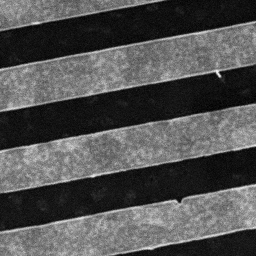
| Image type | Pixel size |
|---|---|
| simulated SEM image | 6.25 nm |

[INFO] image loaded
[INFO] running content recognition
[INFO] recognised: one or a few lines or trenches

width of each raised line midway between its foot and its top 0.259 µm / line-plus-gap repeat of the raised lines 504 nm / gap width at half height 0.241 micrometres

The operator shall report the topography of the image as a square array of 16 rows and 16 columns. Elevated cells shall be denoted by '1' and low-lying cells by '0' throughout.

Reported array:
1111111000000000
1100000000000001
0000000000111111
0000111111111111
1111111111111000
1111111100000000
1100000000000000
0000000000011111
0000011111111111
1111111111111100
1111111110000000
1110000000000000
0000000000011111
0000001111111111
1111111111111100
1111111111000000